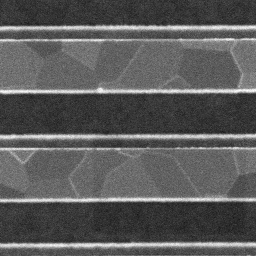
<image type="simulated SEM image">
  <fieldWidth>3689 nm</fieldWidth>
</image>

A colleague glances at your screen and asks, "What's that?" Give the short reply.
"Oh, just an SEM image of lines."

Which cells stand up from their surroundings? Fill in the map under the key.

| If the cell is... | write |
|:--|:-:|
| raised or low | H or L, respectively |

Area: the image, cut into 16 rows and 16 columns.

LLLLLLLLLLLLLLLL
LLLLLLLLLLLLLLLL
HHHHHHHHHHHHHHHH
HHHHHHHHHHHHHHHH
HHHHHHHHHHHHHHHH
HHHHHHHHHHHHHHHH
LLLLLLLLLLLLLLLL
LLLLLLLLLLLLLLLL
LLLLLLLLLLLLLLLL
HHHHHHHHHHHHHHHH
HHHHHHHHHHHHHHHH
HHHHHHHHHHHHHHHH
LLLLLLLLLLLLLLLL
LLLLLLLLLLLLLLLL
LLLLLLLLLLLLLLLL
LLLLLLLLLLLLLLLL